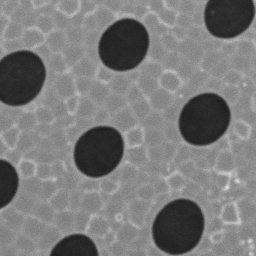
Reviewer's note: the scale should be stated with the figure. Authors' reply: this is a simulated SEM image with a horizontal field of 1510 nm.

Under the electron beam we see holes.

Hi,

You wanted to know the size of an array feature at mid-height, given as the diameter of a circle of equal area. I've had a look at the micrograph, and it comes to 306 nm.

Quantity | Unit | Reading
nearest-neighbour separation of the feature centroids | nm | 646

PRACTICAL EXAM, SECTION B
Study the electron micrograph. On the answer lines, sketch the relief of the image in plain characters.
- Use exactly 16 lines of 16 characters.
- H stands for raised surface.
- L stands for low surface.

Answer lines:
HHHHHHHHHHHHHLLL
HHHHHHHLLHHHHLLL
HHHHHHLLLHHHHHHH
LLHHHHLLLHHHHHHH
LLLHHHHHHHHHHHHH
LLLHHHHHHHHHHHHH
LLHHHHHHHHHHLLHH
HHHHHHHHHHHLLLHH
HHHHHLLLHHHLLLHH
HHHHHLLLHHHHHHHH
LHHHHLLHHHHHHHHH
LHHHHHHHHHHHHHHH
LHHHHHHHHHHLHHHH
HHHHHHHHHHLLLHHH
HHHHHHHHHHLLLHHH
HHHLLLHHHHLLHHHH